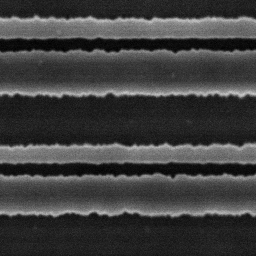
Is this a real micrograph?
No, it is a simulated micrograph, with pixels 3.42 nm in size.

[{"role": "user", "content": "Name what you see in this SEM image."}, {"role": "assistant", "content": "lines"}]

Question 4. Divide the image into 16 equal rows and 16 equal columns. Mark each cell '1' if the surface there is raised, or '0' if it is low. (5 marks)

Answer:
0000000000000000
1111111111111111
1111111111111111
1111111111111111
1111111111111111
1111111111111111
0000000000000000
0000000000000000
0000000000000000
1111111111111111
1111111111111111
1111111111111111
1111111111111111
0000000000000000
0000000000000000
0000000000000000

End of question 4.